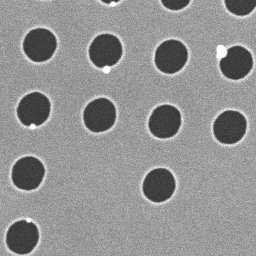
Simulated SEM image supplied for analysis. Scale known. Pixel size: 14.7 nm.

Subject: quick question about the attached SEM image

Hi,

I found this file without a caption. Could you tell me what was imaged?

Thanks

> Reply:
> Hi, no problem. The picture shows a regular array of holes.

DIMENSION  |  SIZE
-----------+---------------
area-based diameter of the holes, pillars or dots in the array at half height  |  0.501 µm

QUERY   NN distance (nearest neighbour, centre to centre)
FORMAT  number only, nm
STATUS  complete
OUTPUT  947